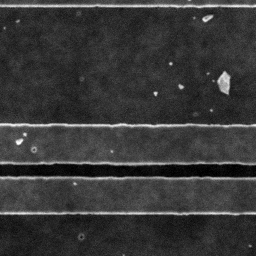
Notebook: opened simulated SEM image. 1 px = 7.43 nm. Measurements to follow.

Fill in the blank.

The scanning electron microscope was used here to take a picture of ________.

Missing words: lines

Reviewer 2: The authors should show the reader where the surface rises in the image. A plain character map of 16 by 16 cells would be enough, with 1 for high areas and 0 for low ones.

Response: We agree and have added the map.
0000000000000000
0000000000000000
0000000000000000
0000000000000000
0000000000000000
0000000000000000
0000000000000000
0000000000000000
1111111111111111
1111111111111111
1111111111111111
1111111111111111
1111111111111111
0000000000000000
0000000000000000
0000000000000000